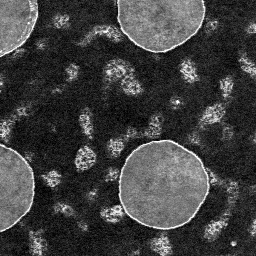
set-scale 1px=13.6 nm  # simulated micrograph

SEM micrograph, raised bodies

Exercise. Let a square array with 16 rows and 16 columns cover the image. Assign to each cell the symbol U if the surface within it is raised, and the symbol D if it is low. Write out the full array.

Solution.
UUDDDDDUUUUUUDDD
UUDDDDDDUUUUUDDD
UUDDDDDDUUUUDDDD
DDDDDDDDDDDDDDDD
DDDDDDDDDDDDDDDD
DDDDDDDDDDDDDDDD
DDDDDDDDDDDDDDDD
DDDDDDDDDDDDDDDD
DDDDDDDDDDDDDDDD
UDDDDDDDUUUUDDDD
UUDDDDDDUUUUUDDD
UUDDDDDDUUUUUDDD
UUDDDDDDUUUUUDDD
UDDDDDDDUUUUDDDD
DDDDDDDDDDDDDDDD
DDDDDDDDDDDDDDDD